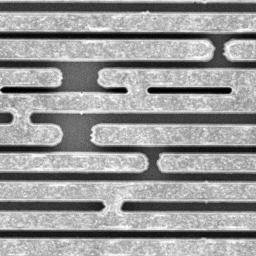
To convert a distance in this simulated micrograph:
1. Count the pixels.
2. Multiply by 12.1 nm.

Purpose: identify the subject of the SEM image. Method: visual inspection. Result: parallel lines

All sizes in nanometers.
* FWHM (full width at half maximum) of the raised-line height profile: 233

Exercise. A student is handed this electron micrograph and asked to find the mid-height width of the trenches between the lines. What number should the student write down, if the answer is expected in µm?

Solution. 0.106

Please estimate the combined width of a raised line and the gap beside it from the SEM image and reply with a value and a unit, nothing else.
343 nm